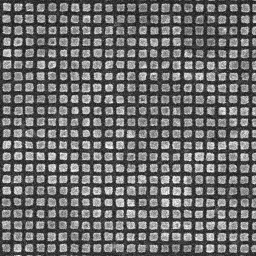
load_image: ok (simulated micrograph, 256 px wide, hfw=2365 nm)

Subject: a regular array of raised bodies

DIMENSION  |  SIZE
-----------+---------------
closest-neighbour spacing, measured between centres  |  102 nanometers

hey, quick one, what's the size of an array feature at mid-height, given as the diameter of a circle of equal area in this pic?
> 73.7 nanometers